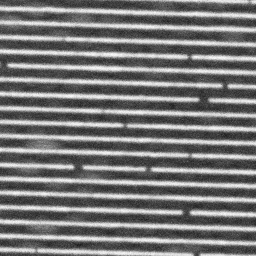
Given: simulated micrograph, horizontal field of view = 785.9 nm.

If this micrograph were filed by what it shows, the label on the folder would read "parallel lines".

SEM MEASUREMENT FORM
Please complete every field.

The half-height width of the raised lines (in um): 0.0084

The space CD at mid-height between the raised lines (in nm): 36.1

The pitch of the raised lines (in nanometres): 43.6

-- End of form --